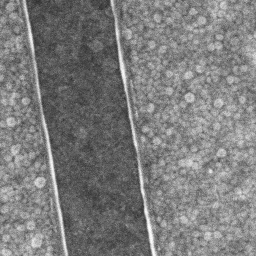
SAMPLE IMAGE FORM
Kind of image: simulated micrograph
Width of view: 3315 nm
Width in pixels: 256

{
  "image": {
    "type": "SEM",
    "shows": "one or a few lines or trenches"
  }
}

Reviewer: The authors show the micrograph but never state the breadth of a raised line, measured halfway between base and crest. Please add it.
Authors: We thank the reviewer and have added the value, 1120 nm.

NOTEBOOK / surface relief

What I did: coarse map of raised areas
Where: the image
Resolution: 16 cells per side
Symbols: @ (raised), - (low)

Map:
--@@@@@---------
--@@@@@---------
--@@@@@---------
--@@@@@@--------
--@@@@@@--------
--@@@@@@--------
---@@@@@--------
---@@@@@--------
---@@@@@--------
---@@@@@@-------
---@@@@@@-------
---@@@@@@-------
----@@@@@-------
----@@@@@-------
----@@@@@-------
----@@@@@@------